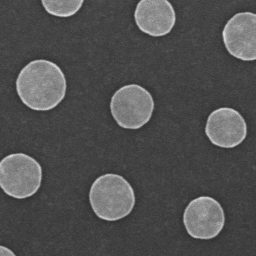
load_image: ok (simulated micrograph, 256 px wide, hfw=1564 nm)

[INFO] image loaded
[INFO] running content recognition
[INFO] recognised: raised bodies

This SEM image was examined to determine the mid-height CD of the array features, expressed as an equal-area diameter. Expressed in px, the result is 42.8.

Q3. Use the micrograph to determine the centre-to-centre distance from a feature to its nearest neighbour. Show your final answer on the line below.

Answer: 568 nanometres